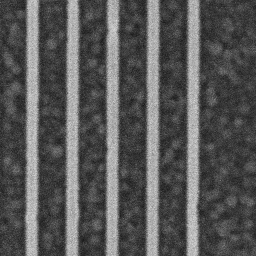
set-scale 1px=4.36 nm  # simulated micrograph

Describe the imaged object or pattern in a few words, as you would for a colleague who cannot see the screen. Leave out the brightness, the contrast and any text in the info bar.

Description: parallel lines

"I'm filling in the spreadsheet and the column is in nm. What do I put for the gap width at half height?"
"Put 131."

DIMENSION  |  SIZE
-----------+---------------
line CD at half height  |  43.6 nm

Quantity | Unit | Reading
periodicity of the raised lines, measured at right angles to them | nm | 175